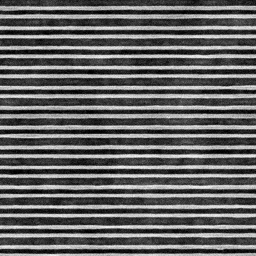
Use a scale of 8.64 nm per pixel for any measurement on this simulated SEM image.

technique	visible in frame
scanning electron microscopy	parallel lines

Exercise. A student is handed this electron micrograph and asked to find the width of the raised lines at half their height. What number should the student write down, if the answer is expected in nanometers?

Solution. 24.9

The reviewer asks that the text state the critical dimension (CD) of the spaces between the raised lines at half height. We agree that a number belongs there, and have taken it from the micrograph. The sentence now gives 5.75 pixels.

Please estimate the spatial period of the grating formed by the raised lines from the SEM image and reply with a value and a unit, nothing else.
0.0861 micrometres